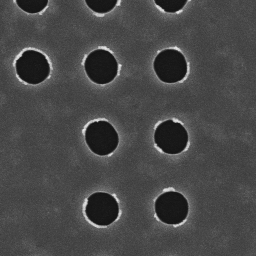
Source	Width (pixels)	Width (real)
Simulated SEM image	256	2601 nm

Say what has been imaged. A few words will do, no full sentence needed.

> holes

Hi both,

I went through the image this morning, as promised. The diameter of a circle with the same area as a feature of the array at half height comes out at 341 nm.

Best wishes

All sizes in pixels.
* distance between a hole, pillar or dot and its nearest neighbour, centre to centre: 69.6